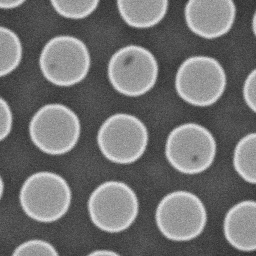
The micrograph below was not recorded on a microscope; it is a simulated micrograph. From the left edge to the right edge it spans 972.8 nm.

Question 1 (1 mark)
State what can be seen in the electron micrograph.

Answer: an array of small figures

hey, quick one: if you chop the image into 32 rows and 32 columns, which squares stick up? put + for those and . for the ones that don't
++.....+++++...++++++..++++++...
.......++++....++++++..++++++...
................++++...++++++...
........................+++++...
++.......................++.....
++....++++......................
+++..++++++....+++..............
++...++++++...+++++.....+++.....
++...++++++...++++++...+++++....
......++++....++++++..++++++...+
.......++.....+++++...++++++...+
...............+++....++++++...+
.......................++++....+
+....+++........................
+...+++++.....++................
+...++++++...+++++..............
+...++++++..++++++....++++......
....++++++..++++++...++++++...++
.....++++....+++++...++++++...++
.............++++....++++++..+++
......................++++...+++
.......................++.....++
...+++++.......................+
...+++++....++++................
...++++++..++++++....+++........
...++++++..++++++...+++++.....++
...+++++...++++++...++++++...+++
.....++.....+++++...++++++..++++
.............+++....+++++...++++
.....................+++....++++
...+++.......................+++
..+++++.....++..................